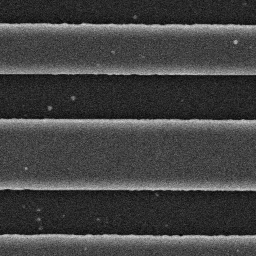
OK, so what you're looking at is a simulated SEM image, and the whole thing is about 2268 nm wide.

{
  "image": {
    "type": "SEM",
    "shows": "lines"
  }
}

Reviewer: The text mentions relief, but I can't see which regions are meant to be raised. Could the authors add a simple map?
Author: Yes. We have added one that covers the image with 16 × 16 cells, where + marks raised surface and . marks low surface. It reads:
................
+++++++.+.......
++++++++++++++++
++++++++++++++++
++++++++++++++++
................
................
+++++++++++.+...
++++++++++++++++
++++++++++++++++
++++++++++++++++
++++++++++++++++
................
................
................
++++++++++++++++